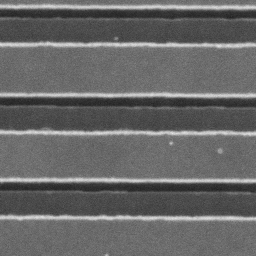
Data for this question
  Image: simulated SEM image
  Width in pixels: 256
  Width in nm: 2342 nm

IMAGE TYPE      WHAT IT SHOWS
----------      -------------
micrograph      lines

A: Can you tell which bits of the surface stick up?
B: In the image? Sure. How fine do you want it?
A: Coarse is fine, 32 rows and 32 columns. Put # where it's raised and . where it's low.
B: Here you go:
################################
................................
................................
................................
................................
.#..###.........................
################################
################################
################################
################################
################################
################################
................................
................................
................................
................................
##.###.#........................
################################
################################
################################
################################
################################
################################
................................
................................
................................
................................
################################
################################
################################
################################
################################